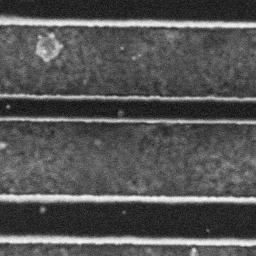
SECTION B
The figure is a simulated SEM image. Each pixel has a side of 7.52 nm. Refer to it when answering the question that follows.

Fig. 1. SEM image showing lines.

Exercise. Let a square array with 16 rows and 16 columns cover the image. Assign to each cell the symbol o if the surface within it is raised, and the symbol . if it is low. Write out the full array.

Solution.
oooooooooooooooo
...o.ooooooooooo
................
................
................
................
oooooooooooooooo
.ooooooooooooooo
................
................
................
................
oooooooooooooooo
oooooooooooooooo
oooooooooooooooo
................